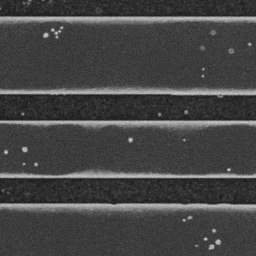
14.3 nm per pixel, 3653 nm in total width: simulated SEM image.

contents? lines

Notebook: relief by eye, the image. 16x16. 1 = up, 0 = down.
0000000000000000
1111111111111111
1111111111111111
1111111111111111
1111111111111111
1111111111111111
0000000000000000
0000000000000000
1111111111111111
1111111111111111
1111111111111111
0000000000000000
0000000000000000
1111111111111111
1111111111111111
1111111111111111